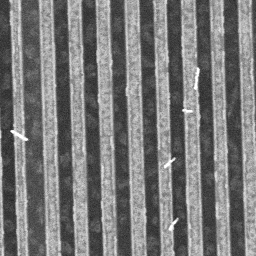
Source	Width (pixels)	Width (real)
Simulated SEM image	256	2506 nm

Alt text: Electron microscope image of parallel lines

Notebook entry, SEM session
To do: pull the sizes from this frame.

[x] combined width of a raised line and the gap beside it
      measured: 281 nanometers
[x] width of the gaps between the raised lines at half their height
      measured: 0.138 µm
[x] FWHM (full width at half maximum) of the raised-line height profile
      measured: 137 nanometers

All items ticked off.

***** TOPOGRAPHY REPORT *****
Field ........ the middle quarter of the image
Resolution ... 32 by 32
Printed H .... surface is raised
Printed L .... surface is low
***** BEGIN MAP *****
LLHHHLLLLHHHLLLLHHHLLLLHHHLLLLHH
LLHHHLLLLHHHLLLLHHHLLLLHHHLLLLHH
LLHHHLLLLHHHLLLLHHHLLLLHHHLLLLHH
LLHHHLLLLHHHLLLLHHHLLLLHHHLLLLHH
LLHHHLLLLHHHLLLLHHHLLLLHHHLLLLHH
LLHHHLLLLHHHLLLLHHHLLLLHHHLLLLHH
LLHHHLLLLHHHLLLLHHHLLLLHHHLLLLHH
LLHHHLLLLHHHLLLLHHHLLLLHHHLLLLHH
LLHHHLLLLHHHLLLLHHHLLLLHHHLLLLHH
LLHHHLLLLHHHLLLLHHHLLLLHHHLLLLHH
LLHHHLLLLHHHLLLLHHHLLLLHHHLLLLHH
LLHHHLLLLHHHLLLLHHHLLLLHHHLLLLHH
LLHHHLLLLHHHLLLLHHHLLLLHHHLLLLHH
LLHHHLLLLHHHLLLLHHHLLLLHHHLLLLHH
LLHHHLLLLHHHLLLLHHHHLLLHHHLLLLHH
LLHHHLLLLHHHLLLLHHHHLLLHHHLLLLHH
LLHHHLLLLHHHLLLLHHHHLLLHHHLLLLHH
LLHHHLLLLHHHLLLLHHHHLLLHHHLLLLHH
LLHHHLLLLHHHLLLLHHHHLLLHHHLLLLHH
LLHHHLLLLHHHLLLLHHHHLLLHHHLLLLHH
LLHHHLLLLHHHLLLLHHHHLLLHHHHLLLHH
LLHHHLLLLHHHLLLLHHHHLLLHHHHLLLLH
LLHHHLLLLHHHLLLLHHHHLLLLHHHLLLLH
LLHHHLLLLHHHHLLLHHHHLLLLHHHLLLLH
LLHHHHLLLHHHHLLLHHHHLLLLHHHLLLLH
LLHHHHLLLHHHHLLLHHHHLLLLHHHLLLLH
LLHHHHLLLHHHHLLLHHHHLLLLHHHLLLLH
LLHHHHLLLHHHHLLLHHHHLLLLHHHLLLLH
LLHHHHLLLHHHHLLLHHHHLLLLHHHLLLLH
LLHHHHLLLHHHHLLLHHHHLLLLHHHLLLLH
LLHHHHLLLHHHHLLLHHHHLLLLHHHLLLLH
LLHHHHLLLHHHHLLLLHHHLLLLHHHLLLLH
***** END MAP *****